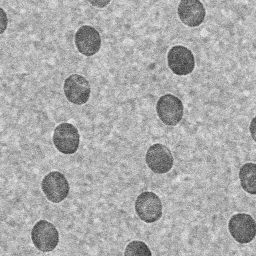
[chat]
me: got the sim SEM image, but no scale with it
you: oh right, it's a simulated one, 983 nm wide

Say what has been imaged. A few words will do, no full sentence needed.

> a regular array of holes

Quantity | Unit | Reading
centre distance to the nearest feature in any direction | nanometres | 192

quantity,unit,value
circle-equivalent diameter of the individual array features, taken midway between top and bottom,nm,115